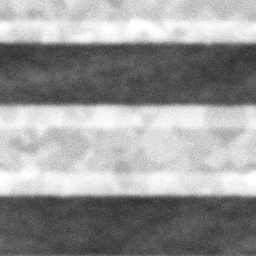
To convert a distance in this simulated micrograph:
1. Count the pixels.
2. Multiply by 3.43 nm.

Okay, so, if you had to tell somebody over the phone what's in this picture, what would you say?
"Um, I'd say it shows one or a few lines or trenches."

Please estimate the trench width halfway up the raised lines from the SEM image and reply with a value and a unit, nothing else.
299 nanometers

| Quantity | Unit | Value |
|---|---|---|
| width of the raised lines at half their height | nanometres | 221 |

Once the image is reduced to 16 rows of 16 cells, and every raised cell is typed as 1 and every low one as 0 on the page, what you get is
1111111111111111
1111111111111111
0000000000000000
0000000000000000
0000000000000000
0000000000000000
0000000000000000
1111111111111111
1111111111111111
1111111111111111
1111111111111111
0000000000000000
0000000000000000
0000000000000000
0000000000000000
0000000000000000